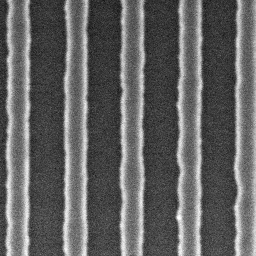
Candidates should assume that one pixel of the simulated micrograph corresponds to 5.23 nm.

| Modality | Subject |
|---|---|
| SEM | lines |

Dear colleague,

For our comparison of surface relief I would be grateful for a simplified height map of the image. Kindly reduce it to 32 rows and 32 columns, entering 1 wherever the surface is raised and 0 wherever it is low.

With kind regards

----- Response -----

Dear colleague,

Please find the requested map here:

01110000111000011100000110000011
01110000111000011100001110000011
01110000111000011100000110000011
01110000111000011100000110000011
01110000111000011100000110000011
01110000111000011100000110000011
01110000111000011100000110000011
01110000111000011100000110000011
01110000111000011100000110000011
01110000111000011100000110000011
01110000111000011100001110000011
01110000111000011100001110000011
01110000111000011100001110000011
01110000111000011100001110000011
01110000111000011100001110000011
01110000111000011100001110000011
01110000111000011100000110000011
01110000111000011100001110000011
01110000111000011100001110000011
01110000111000011100001110000011
01110000111000011100001110000111
01110000111000011100000110000111
01110000111000011100001110000011
01110000111000011100001110000011
01110000111000011100001110000011
01110000111000011100000110000111
01110000111000011100001110000111
01110000111000011100001110000011
01100000111000011100001110000011
01100000111000011100001110000011
01110000111000011100001110000011
01100000111000011100001110000011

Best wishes